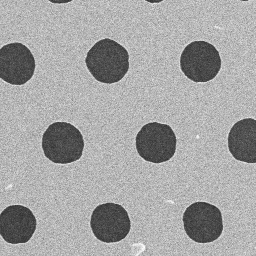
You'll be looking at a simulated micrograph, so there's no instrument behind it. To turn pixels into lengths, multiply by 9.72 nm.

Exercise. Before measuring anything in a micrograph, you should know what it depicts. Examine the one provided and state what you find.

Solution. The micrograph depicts holes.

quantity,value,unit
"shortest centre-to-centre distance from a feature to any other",898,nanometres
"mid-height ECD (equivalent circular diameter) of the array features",400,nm